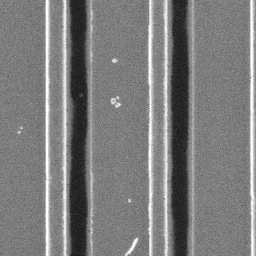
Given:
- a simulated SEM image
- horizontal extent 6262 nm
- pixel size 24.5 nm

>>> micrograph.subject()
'lines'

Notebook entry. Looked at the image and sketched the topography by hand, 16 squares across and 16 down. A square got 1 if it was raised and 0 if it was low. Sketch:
1111001111001111
1111001111001111
1111001111001111
1111001111001111
1111001111001111
1111001111001111
1111001111001111
1111001111001111
1111001111001111
1111001111001111
1111001111001111
1111001111001111
1111001111001111
1111001111001111
1111001111001111
1111001111001111